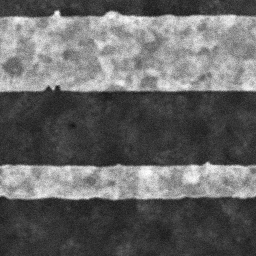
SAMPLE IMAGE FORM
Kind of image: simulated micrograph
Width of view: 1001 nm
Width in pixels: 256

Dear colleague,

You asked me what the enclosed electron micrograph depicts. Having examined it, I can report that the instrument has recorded one or a few lines or trenches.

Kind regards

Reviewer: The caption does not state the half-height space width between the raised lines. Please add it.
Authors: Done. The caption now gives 300 nanometres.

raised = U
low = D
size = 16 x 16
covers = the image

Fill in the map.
DDDDDDDDDDDDDDDD
UUUUUUUUUUUUUUUU
UUUUUUUUUUUUUUUU
UUUUUUUUUUUUUUUU
UUUUUUUUUUUUUUUU
UUUDUUUUUUUUUUUU
DDDDDDDDDDDDDDDD
DDDDDDDDDDDDDDDD
DDDDDDDDDDDDDDDD
DDDDDDDDDDDDDDDD
UUUUUUDUUUUUUUUU
UUUUUUUUUUUUUUUU
DDDDDDDDDDDDDDDD
DDDDDDDDDDDDDDDD
DDDDDDDDDDDDDDDD
DDDDDDDDDDDDDDDD